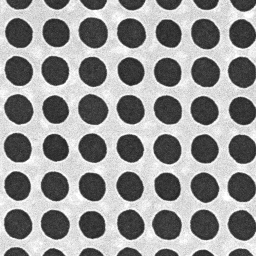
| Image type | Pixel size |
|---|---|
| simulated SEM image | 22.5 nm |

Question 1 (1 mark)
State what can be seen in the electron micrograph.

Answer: a regular array of holes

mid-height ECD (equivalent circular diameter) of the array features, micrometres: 0.662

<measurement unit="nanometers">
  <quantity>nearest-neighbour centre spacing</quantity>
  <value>834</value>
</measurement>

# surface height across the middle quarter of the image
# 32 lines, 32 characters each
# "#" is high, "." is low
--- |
.###......###.......###......###
.##........##.......##.......###
.###.......##.......##.......###
.###.......###......###......###
#####.....#####....####......###
######...#######.########...####
################################
######..########################
####.....#####.....####.....####
.###......###.......###......###
.##........##.......##.......###
.##........##.......##........##
.###.......##.......###.......##
.###.......###......###......###
#####.....#####....#####.....###
################################
################################
######..########.########.######
####......####.....####.....####
.###......###......####......###
.##........##.......##.......###
.###.......##.......##........#.
.###.......###......##.......###
.####.....####.....####......###
######...#######..######....####
################################
################################
#####....#####....######...#####
.###......####.....####.....####
.###......###.......##.......###
.###......###.......###......##.
.###......###.......###......###